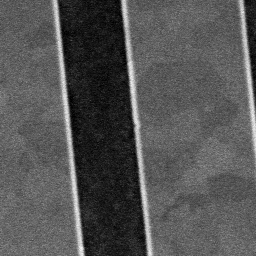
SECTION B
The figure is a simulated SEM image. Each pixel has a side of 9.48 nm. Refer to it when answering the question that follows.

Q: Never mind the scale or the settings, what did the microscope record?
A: one or a few lines or trenches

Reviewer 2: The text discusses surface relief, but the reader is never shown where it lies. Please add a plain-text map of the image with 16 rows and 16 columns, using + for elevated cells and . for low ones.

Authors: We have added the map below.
+++.....+++++++.
++++....+++++++.
++++....+++++++.
++++....+++++++.
++++....++++++++
++++....++++++++
++++....++++++++
++++....++++++++
++++.....+++++++
++++.....+++++++
+++++....+++++++
+++++....+++++++
+++++....+++++++
+++++....+++++++
+++++....+++++++
+++++....+++++++